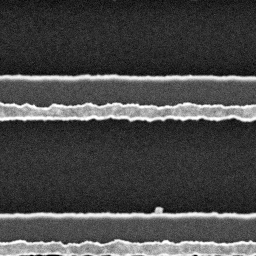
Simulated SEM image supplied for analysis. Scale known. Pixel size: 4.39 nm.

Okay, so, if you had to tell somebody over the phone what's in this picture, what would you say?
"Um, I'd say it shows lines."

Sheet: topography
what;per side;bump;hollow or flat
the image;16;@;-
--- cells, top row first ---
----------------
----------------
----------------
----------------
----------------
@@@@@@@@@@@@@@@@
@@@@@@@@@@@@@@@@
----------------
----------------
----------------
----------------
----------------
----------------
@@@@@@@@@@@@@@@@
@@@@@@@@@@@@@@@@
@@@@@@@@@@@@@@@@